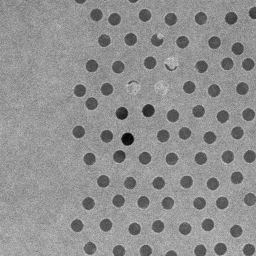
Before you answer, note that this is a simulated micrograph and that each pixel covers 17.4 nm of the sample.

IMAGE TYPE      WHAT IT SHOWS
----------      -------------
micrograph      a regular array of holes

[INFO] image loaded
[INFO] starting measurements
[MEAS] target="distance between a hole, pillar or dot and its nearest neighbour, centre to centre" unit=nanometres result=407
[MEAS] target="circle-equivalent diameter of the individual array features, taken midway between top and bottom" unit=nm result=235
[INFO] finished